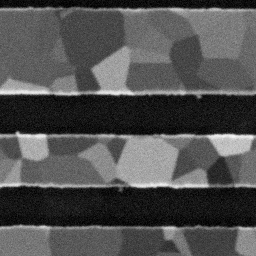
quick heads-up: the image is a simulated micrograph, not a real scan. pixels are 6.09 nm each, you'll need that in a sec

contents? lines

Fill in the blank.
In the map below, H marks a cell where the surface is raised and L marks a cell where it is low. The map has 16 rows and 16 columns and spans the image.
LLHHHLLLLLLLLLLL
HHHHHHHHHHHHHHHH
HHHHHHHHHHHHHHHH
HHHHHHHHHHHHHHHH
HHHHHHHHHHHHHHHH
HHHHHHHHHHHHHHHH
LLLLLLLLLLLLLLLL
LLLLLLLLLLLLLLLL
HHHHHHHHHHHHHHHH
HHHHHHHHHHHHHHHH
HHHHHHHHHHHHHHHH
HHHHHHHHHHHHHHHH
LLLLLLLLLLLLLLLL
LLLLLLLLLLLLLLLL
HHHHHHHHHHHHHHHH
HHHHHHHHHHHHHHHH